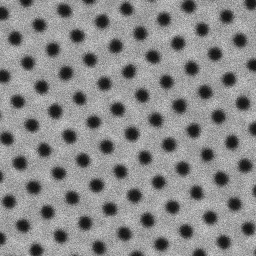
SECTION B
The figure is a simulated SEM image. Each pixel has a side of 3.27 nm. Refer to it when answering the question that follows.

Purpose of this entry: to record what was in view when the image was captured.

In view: a regular array of holes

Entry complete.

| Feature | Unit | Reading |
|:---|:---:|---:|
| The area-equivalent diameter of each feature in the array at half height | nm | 42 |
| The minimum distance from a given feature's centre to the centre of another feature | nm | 90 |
